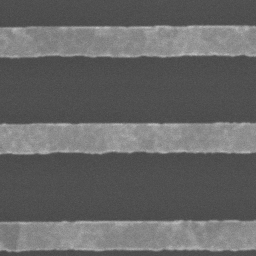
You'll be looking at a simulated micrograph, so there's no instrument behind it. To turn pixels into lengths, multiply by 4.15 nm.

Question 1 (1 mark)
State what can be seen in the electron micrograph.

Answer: lines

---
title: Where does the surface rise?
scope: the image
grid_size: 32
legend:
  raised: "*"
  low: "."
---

................................
................................
................................
...*****************************
********************************
********************************
********************************
................................
................................
................................
................................
................................
................................
................................
................................
...........................*....
********************************
********************************
********************************
................................
................................
................................
................................
................................
................................
................................
................................
................................
********************************
********************************
********************************
................................